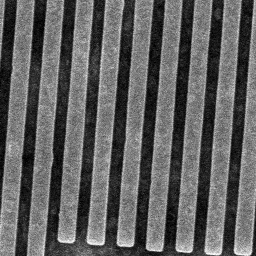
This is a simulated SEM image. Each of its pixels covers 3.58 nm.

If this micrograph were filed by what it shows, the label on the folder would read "parallel lines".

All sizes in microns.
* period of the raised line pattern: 0.106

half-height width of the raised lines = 59.8 nanometers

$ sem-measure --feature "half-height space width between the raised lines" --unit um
0.046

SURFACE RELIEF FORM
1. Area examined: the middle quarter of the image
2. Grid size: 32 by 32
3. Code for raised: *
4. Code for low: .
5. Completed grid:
..****...*****...****...****....
..****...****....****...****...*
..****...****....****...****...*
..****...****...*****...****...*
..****...****...*****...****...*
.*****...****...*****...****...*
.****....****...****....****...*
.****....****...****....****...*
.****....****...****...*****...*
.****....****...****...*****...*
.****....****...****...*****...*
.****...****....****...*****...*
.****...****....****...****....*
.****...****....****...****...**
.****...****....****...****...**
.****...****....****...****...**
.****...****....***....****...**
.****...****....***....****...**
*****...****....***....****...**
*****...****...****....****...**
*****...****...****....****...**
****....****...****...*****...**
****....****...****...*****...**
****...*****...****...*****...**
****...****....****...****....**
****...****....****...****....**
****...****....****...****...***
****...****....****...****...***
****...****....****...****...***
****...****...****....****...***
****...****...****....****...***
****...****...****....****...***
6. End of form